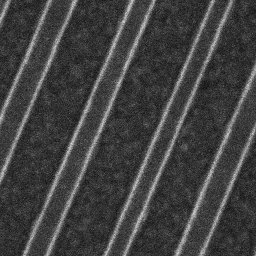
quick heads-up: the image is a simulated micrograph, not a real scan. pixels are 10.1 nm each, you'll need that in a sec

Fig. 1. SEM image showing one or a few lines or trenches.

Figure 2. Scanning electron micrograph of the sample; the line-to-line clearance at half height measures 522 nm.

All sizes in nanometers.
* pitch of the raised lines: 725